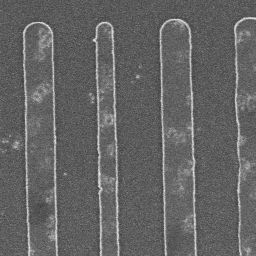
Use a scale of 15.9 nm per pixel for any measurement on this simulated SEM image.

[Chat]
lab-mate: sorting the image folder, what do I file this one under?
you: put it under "one or a few lines or trenches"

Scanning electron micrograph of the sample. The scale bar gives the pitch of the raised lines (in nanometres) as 1090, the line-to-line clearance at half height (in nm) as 712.